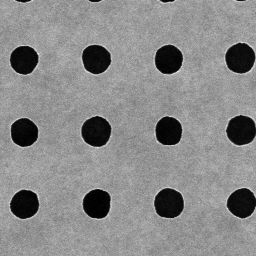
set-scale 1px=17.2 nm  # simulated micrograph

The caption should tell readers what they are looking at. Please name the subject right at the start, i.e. a regular array of holes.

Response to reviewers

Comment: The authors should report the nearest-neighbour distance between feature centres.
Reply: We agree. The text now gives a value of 1230 nm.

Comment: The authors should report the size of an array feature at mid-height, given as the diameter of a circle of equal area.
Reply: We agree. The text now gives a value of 499 nm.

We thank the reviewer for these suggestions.